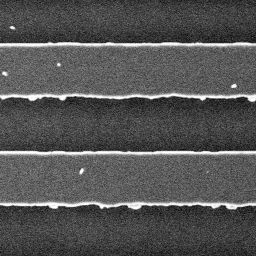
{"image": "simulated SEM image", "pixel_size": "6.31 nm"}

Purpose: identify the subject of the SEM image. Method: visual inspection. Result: lines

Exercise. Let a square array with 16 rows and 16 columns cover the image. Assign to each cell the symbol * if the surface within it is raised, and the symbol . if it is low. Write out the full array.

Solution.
................
................
................
****************
****************
****************
................
................
................
****.***.*******
****************
****************
****************
................
................
................